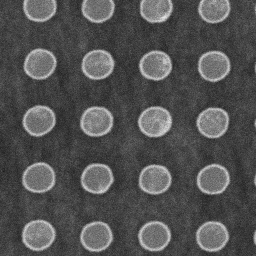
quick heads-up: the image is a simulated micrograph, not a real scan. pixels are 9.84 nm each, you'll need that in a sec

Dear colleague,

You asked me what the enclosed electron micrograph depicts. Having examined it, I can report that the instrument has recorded a regular array of raised bodies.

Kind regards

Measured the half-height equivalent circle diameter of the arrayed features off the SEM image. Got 0.297 um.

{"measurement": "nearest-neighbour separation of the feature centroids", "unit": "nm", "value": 559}